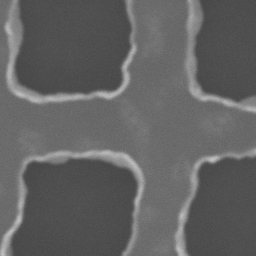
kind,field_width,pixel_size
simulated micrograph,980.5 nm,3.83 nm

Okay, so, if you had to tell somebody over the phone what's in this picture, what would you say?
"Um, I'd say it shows holes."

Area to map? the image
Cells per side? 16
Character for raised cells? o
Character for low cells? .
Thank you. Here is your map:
o.......oooo....
o.......oooo....
o.......oooo....
o.......oooo....
o.......oooo....
oo.....ooooo....
ooooooooooooooo.
oooooooooooooooo
oooooooooooooooo
oooooooooooooooo
oo......ooooo...
oo.......ooo....
oo......oooo....
o.......oooo....
o.......ooo.....
o.......oooo....